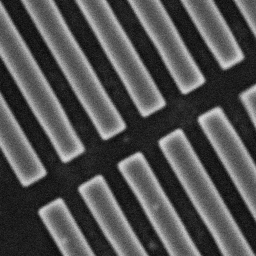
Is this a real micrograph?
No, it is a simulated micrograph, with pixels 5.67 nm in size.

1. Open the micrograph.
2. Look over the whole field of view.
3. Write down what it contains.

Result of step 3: groups of lines, slits or small figures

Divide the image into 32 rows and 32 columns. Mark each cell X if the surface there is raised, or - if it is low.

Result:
---XXXX---XXX---XXXX---XXXX---XX
X---XXX---XXXX---XXXX---XXX---XX
X---XXXX---XXXX---XXX---XXXX---X
XX---XXX----XXX---XXXX---XXXX--X
XX---XXXX---XXXX---XXX---XXXX---
XXX---XXXX---XXX---XXXX---XXX---
XXXX---XXX---XXXX---XXX----XXX--
XXXX---XXXX---XXXX---XXX---XXX--
-XXXX---XXX---XXXX---XXXX-------
--XXX---XXXX---XXXX---XXX-------
--XXXX---XXX----XXX---XXX-------
---XXXX--XXXX---XXXX---X-------X
---XXXX---XXXX---XXX----------XX
X---XXXX---XXX---XXX-----------X
XX---XXX---XXXX----------XXX---X
XX---XXXX---XXX----------XXXX---
XXX---XXX---XXX-------X---XXX---
XXX---XXXX----------XXX---XXXX--
XXXX---XXX----------XXXX---XXXX-
-XXXX---X--------X---XXX---XXXX-
-XXXX----------XXX---XXXX---XXXX
--XXXX---------XXXX---XXXX---XXX
--XXX------XX---XXXX---XXX---XXX
----------XXXX--XXXX---XXXX---XX
----------XXXX---XXXX---XXX---XX
------XX---XXXX---XXX---XXXX---X
-----XXXX--XXXX---XXXX---XXXX--X
-----XXXX---XXXX---XXXX---XXX---
------XXXX---XXX---XXXX---XXXX--
-------XXX---XXXX---XXX----XXX--
-------XXXX---XXXX---XXX---XXXX-
--------XXXX---XXX---XXXX---XXXX